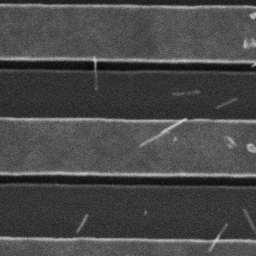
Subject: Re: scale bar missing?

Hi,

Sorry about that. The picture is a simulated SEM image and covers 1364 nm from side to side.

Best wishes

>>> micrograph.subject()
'lines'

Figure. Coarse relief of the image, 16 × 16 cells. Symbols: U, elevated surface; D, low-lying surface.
UUUUUUUUUUUUUUUU
UUUUUUUUUUUUUUUU
UUUUUUUUUUUUUUUU
UUUUUUUUUUUUUUUU
DDDDDDDDDDDDDDDD
DDDDDDDDDDDDDDDD
DDDDDDDDDDDDDDDD
UUUUUUUUDDDUUDDD
UUUUUUUUUUUUUUUU
UUUUUUUUUUUUUUUU
UUUUUUUUUUUUUUUU
DDDDDDDDDDDDDDDD
DDDDDDDDDDDDDDDD
DDDDDDDDDDDDDDDD
DDDDDDDDDDDDDDDD
UUUUUUUUUUUUUUUU